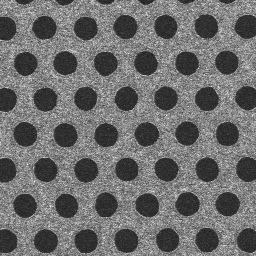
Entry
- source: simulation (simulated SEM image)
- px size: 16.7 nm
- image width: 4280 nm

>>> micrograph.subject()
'a regular array of holes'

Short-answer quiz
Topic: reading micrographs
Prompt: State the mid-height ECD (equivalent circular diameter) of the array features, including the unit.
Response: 404 nanometers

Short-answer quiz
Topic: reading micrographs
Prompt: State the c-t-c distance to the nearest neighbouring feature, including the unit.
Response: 668 nanometers